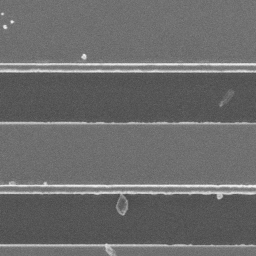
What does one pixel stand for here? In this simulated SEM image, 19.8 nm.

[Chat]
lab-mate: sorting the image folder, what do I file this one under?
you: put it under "lines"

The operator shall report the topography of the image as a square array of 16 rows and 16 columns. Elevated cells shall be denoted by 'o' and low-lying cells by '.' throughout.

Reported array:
oooooooooooooooo
oooooooooooooooo
oooooooooooooooo
oooooooooooooooo
................
................
................
................
oooooooooooooooo
oooooooooooooooo
oooooooooooooooo
oooooooooooooooo
................
................
................
oooooooooooooooo